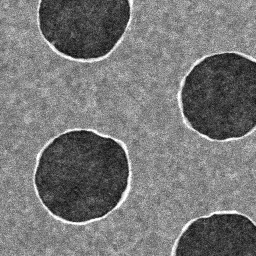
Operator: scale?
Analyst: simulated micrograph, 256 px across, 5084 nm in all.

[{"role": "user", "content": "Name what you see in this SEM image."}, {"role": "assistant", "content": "holes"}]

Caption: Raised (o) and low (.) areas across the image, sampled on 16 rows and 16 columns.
oo......oooooooo
oo......oooooooo
ooo....ooooooooo
oooo..ooooooo..o
oooooooooooo....
ooooooooooo.....
ooooooooooo.....
oooooooooooo....
oooo..ooooooo..o
ooo.....oooooooo
oo......oooooooo
oo......oooooooo
ooo.....oooooooo
oooo..ooooooo..o
ooooooooooo.....
ooooooooooo.....